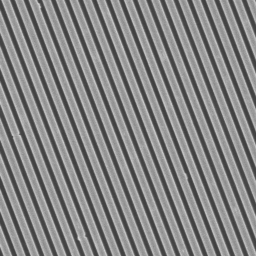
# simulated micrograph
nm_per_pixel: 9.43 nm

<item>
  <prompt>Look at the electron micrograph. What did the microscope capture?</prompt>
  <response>parallel lines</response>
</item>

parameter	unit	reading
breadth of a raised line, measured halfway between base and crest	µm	0.0794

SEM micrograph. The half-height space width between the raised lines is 44.1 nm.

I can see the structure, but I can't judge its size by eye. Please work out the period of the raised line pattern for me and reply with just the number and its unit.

0.12 µm